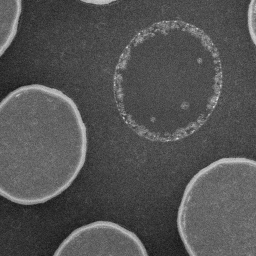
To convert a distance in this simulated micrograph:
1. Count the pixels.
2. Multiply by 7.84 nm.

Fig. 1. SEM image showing raised bodies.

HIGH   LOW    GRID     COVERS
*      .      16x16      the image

*...............
*...............
*...............
................
................
.**.............
*****...........
*****...........
*****...........
*****...........
*****........***
****........****
.**........*****
...........*****
.....***...*****
....*****...****